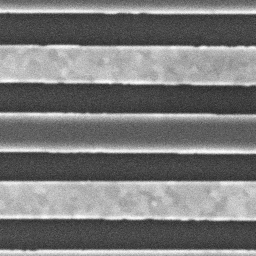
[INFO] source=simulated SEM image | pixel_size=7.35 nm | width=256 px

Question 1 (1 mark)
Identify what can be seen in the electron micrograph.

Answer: lines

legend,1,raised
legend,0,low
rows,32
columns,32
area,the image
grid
11111111111111111111111111111111
01111111111111111111111111111111
00000000000000000000000000000000
00000000000000000000000000000000
00000000000000000000000000000000
00000000000000000000000000000000
11111111111111111111111111111111
11111111111111111111111111111111
11111111111111111111111111111111
11111111111111111111111111111111
00000000000000000000010011111111
00000000000000000000000000000000
00000000000000000000000000000000
00000000000000000000000000000000
11111111111111111111111111111111
11111111111111111111111111111111
11111111111111111111111111111111
11111111111111111111111111111111
11111111111111111111111111111111
00000000000000000000000000000000
00000000000000000000000000000000
00000000000000000000000000000000
00000000000000000000000000000000
11111111111111111111111111111111
11111111111111111111111111111111
11111111111111111111111111111111
11111111111111111111111111111111
00000000000000000000000000000000
00000000000000000000000000000000
00000000000000000000000000000000
00000000000000000000000000000000
11111111111111111111111111111111